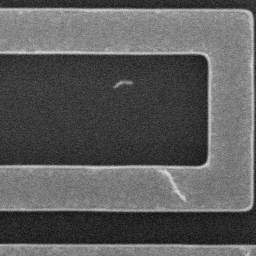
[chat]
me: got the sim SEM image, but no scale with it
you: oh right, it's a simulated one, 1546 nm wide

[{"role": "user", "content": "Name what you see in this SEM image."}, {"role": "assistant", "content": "groups of lines, slits or small figures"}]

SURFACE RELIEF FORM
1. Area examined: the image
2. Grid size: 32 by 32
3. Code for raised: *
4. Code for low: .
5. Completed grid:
................................
*******************************.
********************************
********************************
********************************
********************************
********************************
..........................******
..........................******
..........................******
..........................******
..........................******
..........................******
..........................******
..........................******
..........................******
..........................******
..........................******
..........................******
..........................******
..........................******
********************************
********************************
********************************
********************************
*******************************.
................................
................................
................................
................................
................................
********************************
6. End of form